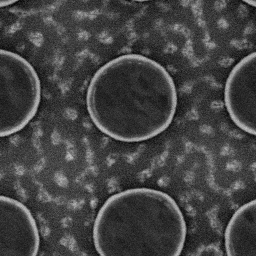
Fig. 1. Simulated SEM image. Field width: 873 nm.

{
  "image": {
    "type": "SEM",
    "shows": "raised bodies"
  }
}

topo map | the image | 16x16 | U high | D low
DDDDDDDDDDDDDDDD
DDDDDDDDDDDDDDDD
DDDDDDDDDDDDDDDD
UDDDDDDDDDDDDDDD
UUDDDDUUUUDDDDDU
UUDDDDUUUUUDDDUU
UUDDDDUUUUUDDDUU
UUDDDDUUUUUDDDDU
DDDDDDDUUDDDDDDD
DDDDDDDDDDDDDDDD
DDDDDDDDDDDDDDDD
DDDDDDDDDDDDDDDD
UDDDDDDUUUUDDDDD
UUDDDDUUUUUDDDDU
UUDDDDUUUUUDDDUU
UUDDDDUUUUUDDDUU